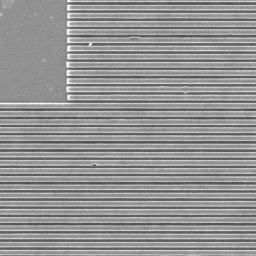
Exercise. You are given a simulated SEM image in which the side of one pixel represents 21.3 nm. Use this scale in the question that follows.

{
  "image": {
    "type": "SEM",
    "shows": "parallel lines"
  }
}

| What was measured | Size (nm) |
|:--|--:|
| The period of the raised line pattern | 174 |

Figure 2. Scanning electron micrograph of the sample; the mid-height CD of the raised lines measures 4.75 pixels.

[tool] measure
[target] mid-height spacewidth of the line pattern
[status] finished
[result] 61.3 nm